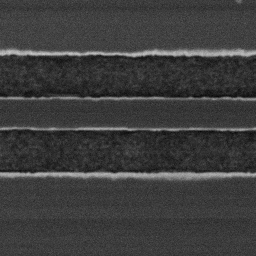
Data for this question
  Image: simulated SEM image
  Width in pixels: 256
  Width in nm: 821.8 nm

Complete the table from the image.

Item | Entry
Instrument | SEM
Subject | lines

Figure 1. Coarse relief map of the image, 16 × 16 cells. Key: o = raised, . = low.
oooooooooooooooo
oooooooooooooooo
oooooooooooooooo
................
................
................
oooooooooooooooo
oooooooooooooooo
................
................
................
oooooooooooooooo
oooooooooooooooo
oooooooooooooooo
oooooooooooooooo
oooooooooooooooo